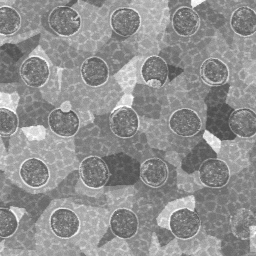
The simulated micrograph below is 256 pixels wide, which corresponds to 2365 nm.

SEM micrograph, a regular array of holes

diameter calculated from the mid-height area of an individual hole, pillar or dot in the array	270	nanometres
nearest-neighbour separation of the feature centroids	539	nanometres